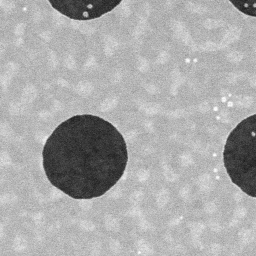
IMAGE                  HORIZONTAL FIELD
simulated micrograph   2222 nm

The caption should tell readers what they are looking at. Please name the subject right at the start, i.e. holes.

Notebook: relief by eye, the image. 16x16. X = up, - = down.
XXX----XXXXXXXX-
XXXXXXXXXXXXXXXX
XXXXXXXXXXXXXXXX
XXXXXXXXXXXXXXXX
XXXXXXXXXXXXXXXX
XXXXXXXXXXXXXXXX
XXXXXXXXXXXXXXXX
XXXX---XXXXXXXX-
XXX-----XXXXXX--
XXX-----XXXXXX--
XXX-----XXXXXX--
XXX----XXXXXXXX-
XXXXXXXXXXXXXXXX
XXXXXXXXXXXXXXXX
XXXXXXXXXXXXXXXX
XXXXXXXXXXXXXXXX